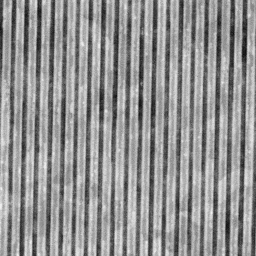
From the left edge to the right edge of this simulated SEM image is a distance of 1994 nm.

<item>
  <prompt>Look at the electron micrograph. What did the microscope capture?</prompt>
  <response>parallel lines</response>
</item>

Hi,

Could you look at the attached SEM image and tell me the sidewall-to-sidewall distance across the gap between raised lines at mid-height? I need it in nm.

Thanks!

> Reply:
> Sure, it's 45.8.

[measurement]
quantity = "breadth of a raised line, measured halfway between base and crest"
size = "53.5 nanometres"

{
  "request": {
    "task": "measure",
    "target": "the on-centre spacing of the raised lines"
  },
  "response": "0.1 micrometres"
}